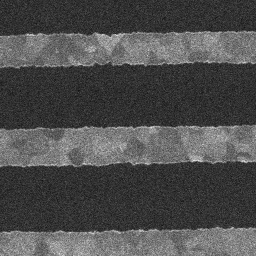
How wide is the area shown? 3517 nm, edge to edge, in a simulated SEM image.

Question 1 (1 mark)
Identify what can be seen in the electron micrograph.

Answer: one or a few lines or trenches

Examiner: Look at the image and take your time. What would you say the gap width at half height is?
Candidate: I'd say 898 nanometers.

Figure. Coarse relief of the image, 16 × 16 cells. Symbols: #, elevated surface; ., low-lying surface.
................
................
################
################
................
................
................
................
################
################
................
................
................
................
.#.#..##########
################